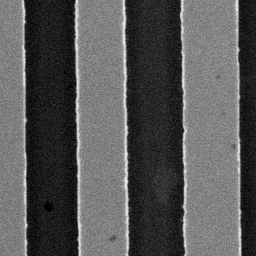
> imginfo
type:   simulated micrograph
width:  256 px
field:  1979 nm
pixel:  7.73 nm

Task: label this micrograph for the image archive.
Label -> lines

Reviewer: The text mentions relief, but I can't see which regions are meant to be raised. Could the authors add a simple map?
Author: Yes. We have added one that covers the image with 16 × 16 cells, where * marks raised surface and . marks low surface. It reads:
**...***...****.
**...***...****.
*....***...****.
**...***...****.
**...***...****.
**...***...****.
**...***...****.
**...***...****.
**...***...****.
**...***...****.
**...***...****.
**...***....***.
**...***...****.
**...***...****.
**...***...****.
**...***....***.